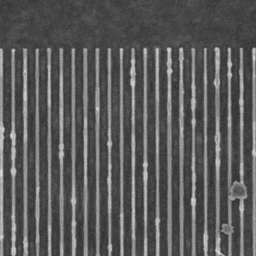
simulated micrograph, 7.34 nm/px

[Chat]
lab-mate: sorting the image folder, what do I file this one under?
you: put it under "parallel lines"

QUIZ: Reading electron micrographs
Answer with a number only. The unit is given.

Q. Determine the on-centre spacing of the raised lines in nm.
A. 88.2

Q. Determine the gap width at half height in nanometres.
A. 69.7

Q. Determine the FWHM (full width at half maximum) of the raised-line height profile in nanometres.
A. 19.3